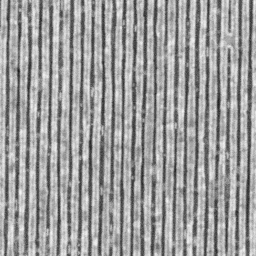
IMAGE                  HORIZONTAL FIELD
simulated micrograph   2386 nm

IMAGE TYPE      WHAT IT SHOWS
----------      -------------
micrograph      parallel lines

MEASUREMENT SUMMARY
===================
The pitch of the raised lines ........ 0.0979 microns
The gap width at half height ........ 46.6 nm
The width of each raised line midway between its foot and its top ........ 46.6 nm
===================